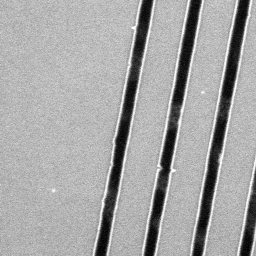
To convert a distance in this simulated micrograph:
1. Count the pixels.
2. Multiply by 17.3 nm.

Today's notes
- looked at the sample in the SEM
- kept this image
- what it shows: parallel lines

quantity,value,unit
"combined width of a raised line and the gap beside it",821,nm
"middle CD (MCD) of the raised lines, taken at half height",245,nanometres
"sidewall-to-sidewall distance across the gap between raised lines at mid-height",0.58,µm